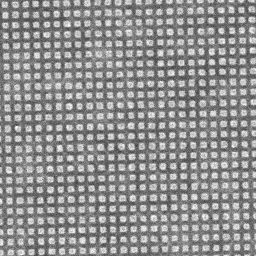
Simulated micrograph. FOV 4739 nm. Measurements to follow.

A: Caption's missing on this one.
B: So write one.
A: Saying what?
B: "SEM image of a regular array of raised bodies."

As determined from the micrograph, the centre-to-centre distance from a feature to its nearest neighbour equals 185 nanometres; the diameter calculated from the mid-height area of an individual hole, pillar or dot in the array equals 104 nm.